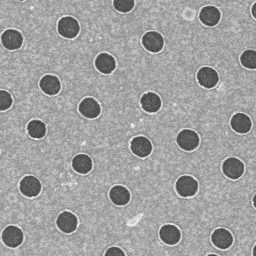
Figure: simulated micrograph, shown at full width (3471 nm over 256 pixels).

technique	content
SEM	a regular array of holes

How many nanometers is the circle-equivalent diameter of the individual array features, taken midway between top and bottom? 294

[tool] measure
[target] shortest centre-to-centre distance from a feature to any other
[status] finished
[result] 668 nm